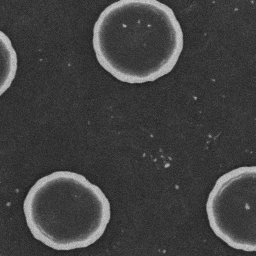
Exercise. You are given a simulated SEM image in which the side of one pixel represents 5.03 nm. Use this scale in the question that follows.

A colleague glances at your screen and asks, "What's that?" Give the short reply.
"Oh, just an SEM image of raised bodies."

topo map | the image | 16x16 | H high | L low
LLLLLLLHHHLLLLLL
LLLLLLHHHHHLLLLL
LLLLLLHHHHHLLLLL
HLLLLLHHHHHLLLLL
HLLLLLLHHHLLLLLL
LLLLLLLLLLLLLLLL
LLLLLLLLLLLLLLLL
LLLLLLLLLLLLLLLL
LLLLLLLLLLLLLLLL
LLLLLLLLLLLLLLLL
LLLLLLLLLLLLLLLL
LLLHHHLLLLLLLLHH
LLHHHHLLLLLLLHHH
LLHHHHHLLLLLLHHH
LLHHHHLLLLLLLLHH
LLLLLLLLLLLLLLLH